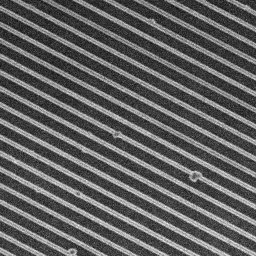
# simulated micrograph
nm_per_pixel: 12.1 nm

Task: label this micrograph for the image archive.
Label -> parallel lines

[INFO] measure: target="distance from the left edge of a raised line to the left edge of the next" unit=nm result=173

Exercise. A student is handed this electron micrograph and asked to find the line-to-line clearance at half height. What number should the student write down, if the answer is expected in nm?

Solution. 131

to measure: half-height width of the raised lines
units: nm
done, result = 33.4